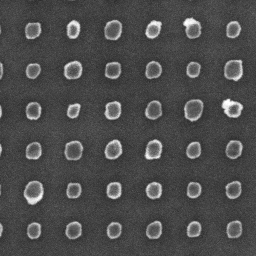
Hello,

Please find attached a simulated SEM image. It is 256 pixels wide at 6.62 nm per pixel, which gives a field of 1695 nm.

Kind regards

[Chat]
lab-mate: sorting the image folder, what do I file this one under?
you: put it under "a regular array of raised bodies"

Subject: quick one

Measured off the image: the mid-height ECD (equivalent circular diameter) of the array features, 0.108 micrometres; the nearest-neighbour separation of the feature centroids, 262 nm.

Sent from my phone